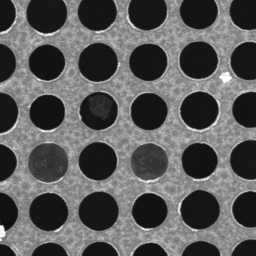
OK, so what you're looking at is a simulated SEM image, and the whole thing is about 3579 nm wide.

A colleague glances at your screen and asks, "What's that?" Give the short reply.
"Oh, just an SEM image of a regular array of holes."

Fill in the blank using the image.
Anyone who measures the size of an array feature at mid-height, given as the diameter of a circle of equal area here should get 539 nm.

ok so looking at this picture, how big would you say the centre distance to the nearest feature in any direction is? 0.689 microns